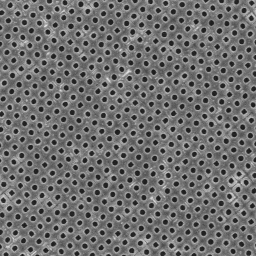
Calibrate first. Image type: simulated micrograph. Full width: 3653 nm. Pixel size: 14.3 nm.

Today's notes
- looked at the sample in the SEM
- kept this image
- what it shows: a regular array of holes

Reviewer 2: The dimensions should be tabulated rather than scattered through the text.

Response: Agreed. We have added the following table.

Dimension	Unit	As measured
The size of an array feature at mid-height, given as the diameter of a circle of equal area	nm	80.5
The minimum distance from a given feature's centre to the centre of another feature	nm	150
